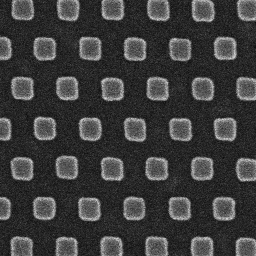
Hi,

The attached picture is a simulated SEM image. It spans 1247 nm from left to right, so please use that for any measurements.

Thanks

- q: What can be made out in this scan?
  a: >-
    a regular array of raised bodies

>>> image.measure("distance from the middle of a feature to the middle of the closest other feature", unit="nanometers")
217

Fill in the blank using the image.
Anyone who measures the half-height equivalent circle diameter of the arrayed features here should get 110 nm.